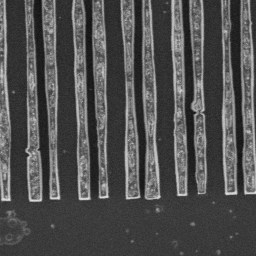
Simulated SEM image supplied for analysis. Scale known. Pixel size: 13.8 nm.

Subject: parallel lines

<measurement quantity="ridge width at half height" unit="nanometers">131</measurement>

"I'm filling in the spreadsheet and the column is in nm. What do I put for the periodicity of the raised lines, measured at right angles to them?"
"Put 333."